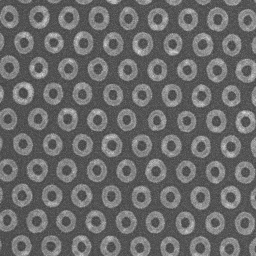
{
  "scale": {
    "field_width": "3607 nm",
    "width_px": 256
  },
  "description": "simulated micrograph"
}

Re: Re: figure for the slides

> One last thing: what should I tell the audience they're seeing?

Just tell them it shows a regular array of ring-shaped raised bodies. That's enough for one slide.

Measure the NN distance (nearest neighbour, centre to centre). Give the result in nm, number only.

408